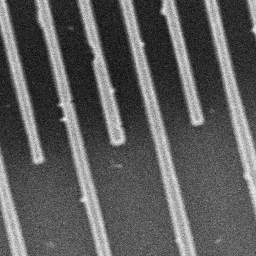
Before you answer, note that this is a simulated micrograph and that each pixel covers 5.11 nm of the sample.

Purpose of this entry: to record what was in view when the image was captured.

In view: parallel lines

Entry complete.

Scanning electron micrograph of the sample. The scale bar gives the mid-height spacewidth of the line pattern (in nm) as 151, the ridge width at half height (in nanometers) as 59.5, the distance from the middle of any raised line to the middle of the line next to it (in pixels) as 40.9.